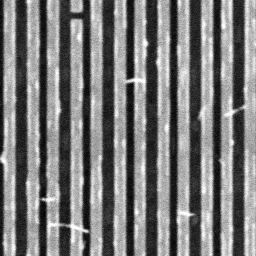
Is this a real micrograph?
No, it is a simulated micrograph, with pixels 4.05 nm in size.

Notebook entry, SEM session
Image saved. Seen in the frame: parallel lines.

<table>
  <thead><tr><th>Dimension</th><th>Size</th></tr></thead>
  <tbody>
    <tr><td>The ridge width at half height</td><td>11.3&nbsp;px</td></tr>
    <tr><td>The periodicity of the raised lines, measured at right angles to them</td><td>88.1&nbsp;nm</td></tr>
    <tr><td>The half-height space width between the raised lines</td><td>49.2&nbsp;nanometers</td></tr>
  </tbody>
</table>